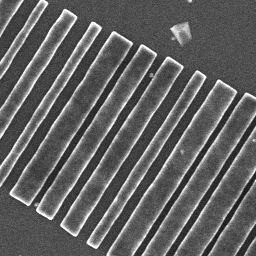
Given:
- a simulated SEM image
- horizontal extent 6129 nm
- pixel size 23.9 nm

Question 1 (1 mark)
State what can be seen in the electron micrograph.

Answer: groups of lines, slits or small figures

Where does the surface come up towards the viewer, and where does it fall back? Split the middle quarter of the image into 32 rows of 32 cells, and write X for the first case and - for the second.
XXX----XXXXXX---XXXXX---XXXXXX--
XX----XXXXXXX--XXXXXX--XXXXXX---
XX----XXXXXX---XXXXX---XXXXXX---
X----XXXXXXX--XXXXXX--XXXXXX----
X---XXXXXXX--XXXXXX---XXXXX----X
----XXXXXX---XXXXX---XXXXXX----X
---XXXXXXX--XXXXXX---XXXXX----XX
--XXXXXXX---XXXXX---XXXXXX----XX
--XXXXXXX--XXXXX---XXXXXX----XXX
-XXXXXXX--XXXXXX---XXXXX----XXXX
XXXXXXX---XXXXX---XXXXX-----XXX-
XXXXXXX--XXXXX---XXXXXX----XXX--
XXXXXX--XXXXX----XXXXX----XXXX--
XXXXX---XXXXX---XXXXXX----XXX---
XXXXX--XXXXXX--XXXXXX----XXX----
XXXX--XXXXXX---XXXXX----XXXX---X
XXX---XXXXX---XXXXXX----XXX----X
XXX--XXXXXX--XXXXXX----XXXX---XX
XX--XXXXXX---XXXXXX----XXX---XXX
XX--XXXXX---XXXXXX----XXX----XXX
X--XXXXXX---XXXXX----XXX----XXXX
--XXXXXX---XXXXXX----XXX---XXXXX
--XXXXX---XXXXXX----XXX----XXXXX
-XXXXXX---XXXXX----XXXX---XXXXXX
-XXXXX---XXXXXX----XXX----XXXXXX
XXXXX----XXXXX----XXXX---XXXXXXX
XXXXX---XXXXX----XXXX---XXXXXXX-
XXXX---XXXXXX----XXX----XXXXXX--
XXX----XXXXX----XXXX---XXXXXXX--
XXX---XXXXXX---XXXX----XXXXXX--X
XX---XXXXXX----XXX----XXXXXX---X
XX--XXXXXX----XXXX---XXXXXXX--XX